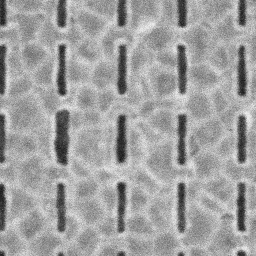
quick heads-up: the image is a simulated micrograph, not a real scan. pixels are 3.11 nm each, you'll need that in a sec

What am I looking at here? a regular array of holes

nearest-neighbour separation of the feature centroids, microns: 0.186